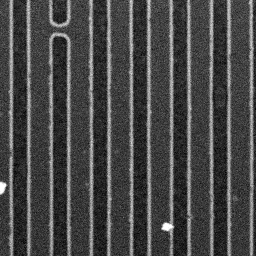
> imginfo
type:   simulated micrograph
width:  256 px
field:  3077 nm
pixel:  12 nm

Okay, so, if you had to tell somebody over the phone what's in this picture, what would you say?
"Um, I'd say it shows parallel lines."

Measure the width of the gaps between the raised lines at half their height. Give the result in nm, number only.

201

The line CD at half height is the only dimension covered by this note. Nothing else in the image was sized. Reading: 0.28 microns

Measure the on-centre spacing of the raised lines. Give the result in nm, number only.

481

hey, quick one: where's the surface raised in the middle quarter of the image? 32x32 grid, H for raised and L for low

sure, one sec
LHHHHHHLLLLHHHHHHLLLLHHHHHHLLLLH
LHHHHHHLLLLHHHHHHLLLLHHHHHHLLLLH
LHHHHHHLLLLHHHHHHLLLLHHHHHHLLLLH
LHHHHHHLLLLHHHHHHLLLLHHHHHHLLLLH
LHHHHHHLLLLHHHHHHLLLLHHHHHHLLLLH
LHHHHHHLLLLHHHHHHLLLLHHHHHHLLLLH
LHHHHHHLLLLHHHHHHLLLLHHHHHHLLLLH
LHHHHHHLLLLHHHHHHLLLLHHHHHHLLLLH
LHHHHHHLLLLHHHHHHLLLLHHHHHHLLLLH
LHHHHHHLLLLHHHHHHLLLLHHHHHHLLLLH
LHHHHHHLLLLHHHHHHLLLLHHHHHHLLLLH
LHHHHHHLLLLHHHHHHLLLLHHHHHHLLLLH
LHHHHHHLLLLHHHHHHLLLLHHHHHHLLLLH
LHHHHHHLLLLHHHHHHLLLLHHHHHHLLLLH
LHHHHHHLLLLHHHHHHLLLLHHHHHHLLLLH
LHHHHHHLLLLHHHHHHLLLLHHHHHHLLLLH
LHHHHHHLLLLHHHHHHLLLLHHHHHHLLLLH
LHHHHHHLLLLHHHHHHLLLLHHHHHHLLLLH
LHHHHHHLLLLHHHHHHLLLLHHHHHHLLLLH
LHHHHHHLLLLHHHHHHLLLLHHHHHHLLLLH
LHHHHHHLLLLHHHHHHLLLLHHHHHHLLLLH
LHHHHHHLLLLHHHHHHLLLLHHHHHHLLLLH
LHHHHHHLLLLHHHHHHLLLLHHHHHHLLLLH
LHHHHHHLLLLHHHHHHLLLLHHHHHHLLLLH
LHHHHHHLLLLHHHHHHLLLLHHHHHHLLLLH
LHHHHHHLLLLHHHHHHLLLLHHHHHHLLLLH
LHHHHHHLLLLHHHHHHLLLLHHHHHHLLLLH
LHHHHHHLLLLHHHHHHLLLLHHHHHHLLLLH
LHHHHHHLLLLHHHHHHLLLLHHHHHHLLLLH
LHHHHHHLLLLHHHHHHLLLLHHHHHHLLLLH
LHHHHHHLLLLHHHHHHLLLLHHHHHHLLLLH
LHHHHHHLLLLHHHHHHLLLLHHHHHHLLLLH